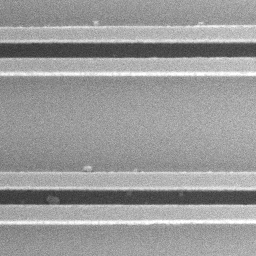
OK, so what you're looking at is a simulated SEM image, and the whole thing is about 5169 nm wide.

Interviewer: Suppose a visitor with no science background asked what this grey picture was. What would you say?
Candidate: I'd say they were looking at lines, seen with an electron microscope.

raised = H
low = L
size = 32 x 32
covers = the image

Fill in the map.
LLLLLLLLLLLLLLLLLLLLLLLLLLLLLLLL
LLLLLLLLLLLLLLLLLLLLLLLLLLLLLLLL
LLLLLLLLLLLLLLLLLLLLLLLLLLLLLLLL
HHHHHHHHHHHHHHHHHHHHHHHHHHHHHHHH
HHHHHHHHHHHHHHHHHHHHHHHHHHHHHHHH
LLLLLLLLLLLLLLLLLLLLLLLLLLLLLLLL
LLLLLLLLLLLLLLLLLLLLLLLLLLLLLLLL
HHHHHHHHHHHHHHHHHHHHHHHHHHHHHHHH
HHHHHHHHHHHHHHHHHHHHHHHHHHHHHHHH
LLLLLLLLLLLLLLLLLLLLLLLLLLLLLLLL
LLLLLLLLLLLLLLLLLLLLLLLLLLLLLLLL
LLLLLLLLLLLLLLLLLLLLLLLLLLLLLLLL
LLLLLLLLLLLLLLLLLLLLLLLLLLLLLLLL
LLLLLLLLLLLLLLLLLLLLLLLLLLLLLLLL
LLLLLLLLLLLLLLLLLLLLLLLLLLLLLLLL
LLLLLLLLLLLLLLLLLLLLLLLLLLLLLLLL
LLLLLLLLLLLLLLLLLLLLLLLLLLLLLLLL
LLLLLLLLLLLLLLLLLLLLLLLLLLLLLLLL
LLLLLLLLLLLLLLLLLLLLLLLLLLLLLLLL
LLLLLLLLLLLLLLLLLLLLLLLLLLLLLLLL
LLLLLLLLLLLLLLLLLLLLLLLLLLLLLLLL
LLLLLLLLLLLLLLLLLLLLLLLLLLLLLLLL
HHHHHHHHHHHHHHHHHHHHHHHHHHHHHHHH
HHHHHHHHHHHHHHHHHHHHHHHHHHHHHHHH
LLLLLLLLLLLLLLLLLLLLLLLLLLLLLLLL
LLLLLLLLLLLLLLLLLLLLLLLLLLLLLLLL
HHHHHHHHHHHHHHHHHHHHHHHHHHHHHHHH
HHHHHHHHHHHHHHHHHHHHHHHHHHHHHHHH
LLLLLLLLLLLLLLLLLLLLLLLLLLLLLLLL
LLLLLLLLLLLLLLLLLLLLLLLLLLLLLLLL
LLLLLLLLLLLLLLLLLLLLLLLLLLLLLLLL
LLLLLLLLLLLLLLLLLLLLLLLLLLLLLLLL